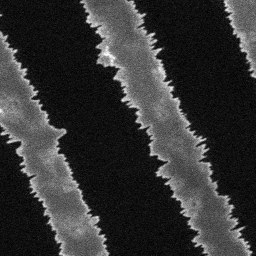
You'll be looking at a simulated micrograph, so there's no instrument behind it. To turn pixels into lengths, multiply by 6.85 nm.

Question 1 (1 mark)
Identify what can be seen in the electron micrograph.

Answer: one or a few lines or trenches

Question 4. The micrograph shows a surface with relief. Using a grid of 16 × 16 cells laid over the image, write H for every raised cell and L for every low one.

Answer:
LLLLLHHHLLLLLLHH
LLLLLLHHHLLLLLHH
LLLLLLHHHLLLLLLH
HLLLLLHHHHLLLLLH
HLLLLLLHHHLLLLLL
HHLLLLLLHHHLLLLL
HHLLLLLLHHHLLLLL
HHHLLLLLLHHHLLLL
HHHHLLLLLHHHLLLL
LHHHLLLLLLHHHLLL
LLHHLLLLLLHHHLLL
LLHHHLLLLLLHHLLL
LLLHHLLLLLLHHHLL
LLLHHHLLLLLLHHHL
LLLHHHLLLLLLHHHL
LLLLHHHLLLLLLHHH